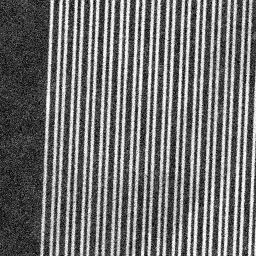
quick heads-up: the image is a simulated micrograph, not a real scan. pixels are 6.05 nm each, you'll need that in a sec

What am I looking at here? parallel lines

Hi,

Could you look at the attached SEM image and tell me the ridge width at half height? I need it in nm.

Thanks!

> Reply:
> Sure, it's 15.9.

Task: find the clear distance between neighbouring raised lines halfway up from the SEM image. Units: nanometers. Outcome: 35.5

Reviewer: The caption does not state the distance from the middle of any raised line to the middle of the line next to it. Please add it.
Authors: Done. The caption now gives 46.4 nm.